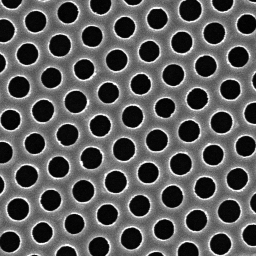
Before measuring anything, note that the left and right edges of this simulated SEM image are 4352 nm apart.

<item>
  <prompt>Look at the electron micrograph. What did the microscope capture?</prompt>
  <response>a regular array of holes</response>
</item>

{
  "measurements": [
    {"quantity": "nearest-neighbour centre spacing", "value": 569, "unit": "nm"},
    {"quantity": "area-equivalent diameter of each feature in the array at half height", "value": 369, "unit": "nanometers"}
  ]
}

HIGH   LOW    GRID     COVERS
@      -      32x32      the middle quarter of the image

@@@-----@@@----@@@@@@@@@@@---@@@
@@-----@@@@@--@@@@@@@@@@@-----@@
@@@----@@@@@@@@@@@@-@@@@@-----@@
@@@---@@@@@@@@@@@----@@@@-----@@
@@@@@@@@@@@@@@@@@-----@@@----@@@
@@@@@@@@@----@@@@-----@@@@@@@@@@
@@@@@@@@@-----@@@----@@@@@@@@@@@
@----@@@------@@@@--@@@@@@@@@@@-
------@@@----@@@@@@@@@@@@-@@@@@-
------@@@@--@@@@@@@@@@@----@@@@-
-----@@@@@@@@@@@--@@@@@-----@@@-
@----@@@@@@@@@@----@@@@-----@@@@
@@@@@@@@@@@@@@@-----@@@----@@@@@
@@@@@@@@---@@@------@@@@@-@@@@@@
@@@@@@@-----@@@-----@@@@@@@@@@--
---@@@------@@@----@@@@@@@@@@---
---@@@@-----@@@@@@@@@@--@@@@@---
----@@@----@@@@@@@@@@----@@@@---
---@@@@@@@@@@@--@@@@@-----@@@---
---@@@@@@@@@@----@@@------@@@@--
-@@@@@@@@@@@------@@@-----@@@@@@
@@@@@----@@@------@@@@---@@@@@@@
@@@@-----@@@------@@@@@@@@@@---@
@@@@------@@@----@@@@@@@@@@-----
-@@@-----@@@@@@@@@@@@@@@@@@-----
-@@@@----@@@@@@@@@@----@@@------
-@@@@@@@@@@@@@@@@@------@@@----@
-@@@@@@@@@@----@@@------@@@@--@@
@@@@@@@@@@------@@@----@@@@@@@@@
@@@---@@@@------@@@@--@@@@@@@@@@
@@-----@@@------@@@@@@@@@@--@@@@
@@------@@@----@@@@@@@@@@----@@@